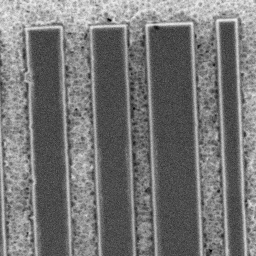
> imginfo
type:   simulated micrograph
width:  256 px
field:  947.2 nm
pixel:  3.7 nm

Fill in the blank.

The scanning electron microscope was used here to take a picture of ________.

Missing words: one or a few lines or trenches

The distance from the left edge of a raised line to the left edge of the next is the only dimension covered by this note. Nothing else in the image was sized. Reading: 225 nm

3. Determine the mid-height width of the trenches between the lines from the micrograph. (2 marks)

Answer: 92.8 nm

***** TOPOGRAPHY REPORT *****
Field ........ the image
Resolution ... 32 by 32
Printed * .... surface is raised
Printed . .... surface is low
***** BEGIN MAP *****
................................
................................
................................
.....**.....****..******...***..
...*****...*****..******...***..
...*****...*****..******...***..
...*****...*****..******...***..
....****...*****...*****...***..
....****....****...*****...***..
...*****....****...*****...***..
....****....****...*****...***..
....****....****...*****....**..
....****....****...*****....**..
....****....****...*****....**..
....****....****...*****....**..
....****....****...******...**..
....****....****...******...**..
....****....****...******...**..
....****....****...******...**..
....****....****...******...**..
....****....****...******...**..
....****....****...******...**..
....****....****...******...**..
....****....*****..******...**..
....*****...*****..******...**..
....*****...*****..******...**..
....*****...*****..******...***.
....*****...*****..******...***.
....*****...*****..******...***.
*...*****...*****..******...***.
*...*****...*****..******...***.
*....****...*****...*****...***.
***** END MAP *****